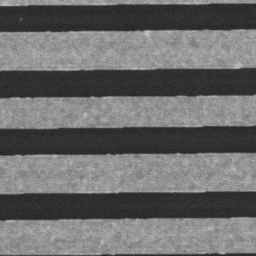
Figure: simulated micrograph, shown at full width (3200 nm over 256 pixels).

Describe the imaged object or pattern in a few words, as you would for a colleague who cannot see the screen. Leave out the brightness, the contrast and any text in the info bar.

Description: lines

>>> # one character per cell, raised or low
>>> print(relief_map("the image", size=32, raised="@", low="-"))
@@@@@@@@@@@@@@@-----------------
--------------------------------
--------------------------------
--------------------------------
@@@@@@@@@@@@@@@@@@@@@@@@@@@@@@@@
@@@@@@@@@@@@@@@@@@@@@@@@@@@@@@@@
@@@@@@@@@@@@@@@@@@@@@@@@@@@@@@@@
@@@@@@@@@@@@@@@@@@@@@@@@@@@@@@@@
@@@@@@@@@@@@@@@@@@@@@@@@@@@@@@--
--------------------------------
--------------------------------
--------------------------------
@@@@@@@@@@@@@@@@@@@@@@@@@@@@@@@@
@@@@@@@@@@@@@@@@@@@@@@@@@@@@@@@@
@@@@@@@@@@@@@@@@@@@@@@@@@@@@@@@@
@@@@@@@@@@@@@@@@@@@@@@@@@@@@@@@@
--------------------------------
--------------------------------
--------------------------------
-@@@@@@@@@@@@@@@@@@@@@@@@@@@@@@@
@@@@@@@@@@@@@@@@@@@@@@@@@@@@@@@@
@@@@@@@@@@@@@@@@@@@@@@@@@@@@@@@@
@@@@@@@@@@@@@@@@@@@@@@@@@@@@@@@@
@@@@@@@@@@@@@@@@@@@@@@@@@@@@@@@@
--------------------------------
--------------------------------
--------------------------------
-------@@@@@@@@@@@@@@@@@@@@@@@@@
@@@@@@@@@@@@@@@@@@@@@@@@@@@@@@@@
@@@@@@@@@@@@@@@@@@@@@@@@@@@@@@@@
@@@@@@@@@@@@@@@@@@@@@@@@@@@@@@@@
@@@@@@@@@@@@@@@@@@@@@@@@@@@@@@@@